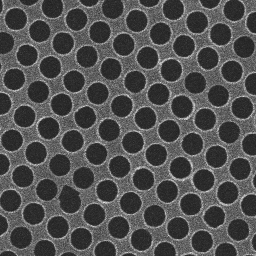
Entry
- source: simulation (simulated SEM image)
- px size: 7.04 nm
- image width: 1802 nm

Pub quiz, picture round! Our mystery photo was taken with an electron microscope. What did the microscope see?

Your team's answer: a regular array of holes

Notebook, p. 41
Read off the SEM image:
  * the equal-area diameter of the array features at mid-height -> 0.152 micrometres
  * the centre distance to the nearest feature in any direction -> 187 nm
